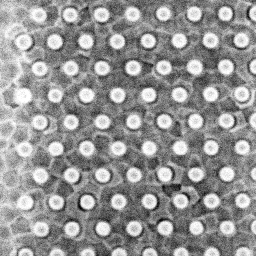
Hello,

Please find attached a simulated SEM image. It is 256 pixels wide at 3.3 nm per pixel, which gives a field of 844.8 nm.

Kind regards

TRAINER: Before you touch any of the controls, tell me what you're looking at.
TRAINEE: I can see a regular array of raised bodies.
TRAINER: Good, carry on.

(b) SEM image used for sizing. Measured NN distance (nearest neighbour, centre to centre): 30.8 pixels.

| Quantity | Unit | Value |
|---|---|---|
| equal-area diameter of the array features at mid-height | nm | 46.1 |